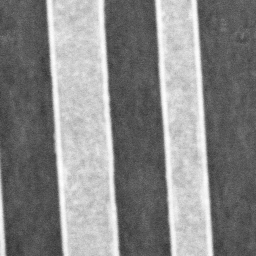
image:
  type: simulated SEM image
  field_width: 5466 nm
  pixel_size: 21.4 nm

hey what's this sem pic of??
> one or a few lines or trenches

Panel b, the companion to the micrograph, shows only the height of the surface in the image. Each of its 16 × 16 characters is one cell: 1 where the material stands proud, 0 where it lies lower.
0001110000110000
0001110000110000
0001110000110000
0001110000110000
0001111000110000
0001111000110000
0000111000111000
0000111000111000
0000111000111000
0000111000111000
0000111000011000
0000111000011000
0000111000011000
0000111000011000
0000111000011000
0000111000011000